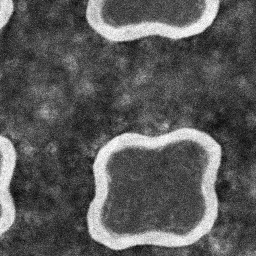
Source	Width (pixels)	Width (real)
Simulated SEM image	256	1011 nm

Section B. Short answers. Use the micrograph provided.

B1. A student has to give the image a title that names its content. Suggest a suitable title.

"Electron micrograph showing raised bodies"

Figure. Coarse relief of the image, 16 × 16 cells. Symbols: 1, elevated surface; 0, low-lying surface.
0000001111111000
0000001111111000
0000000000000000
0000000000000000
0000000000000000
0000000000000000
0000000000000000
0000000000000000
0000000000010000
0000000111111000
0000001111111000
0000001111111000
0000001111111000
0000001111111000
0000001111110000
0000000000000000